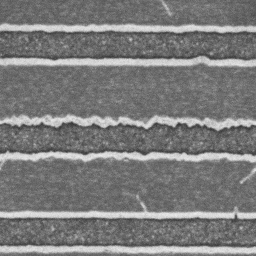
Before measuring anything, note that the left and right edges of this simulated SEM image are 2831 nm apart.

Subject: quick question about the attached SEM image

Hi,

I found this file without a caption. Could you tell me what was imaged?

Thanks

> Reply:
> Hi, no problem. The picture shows one or a few lines or trenches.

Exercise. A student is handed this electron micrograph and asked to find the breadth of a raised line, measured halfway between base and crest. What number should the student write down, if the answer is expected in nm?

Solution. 654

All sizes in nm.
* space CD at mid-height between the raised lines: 380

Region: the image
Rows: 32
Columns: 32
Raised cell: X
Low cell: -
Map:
XXXXXXXXXXXXXXXXXXXXXXXXXXXXXXXX
XXXXXXXXXXXXXXXXXXXXXXXXXXXXXXXX
XXXXXXXXXXXXXXXXXXXXXXXXXXXXXXXX
--X---X-XXX-X----XXXXXXX-XXXXXXX
--------------------------------
--------------------------------
--------------------------------
--------------------------------
XXXXXXXXXXXXXXXXXXXXXXXXXXXXXXXX
XXXXXXXXXXXXXXXXXXXXXXXXXXXXXXXX
XXXXXXXXXXXXXXXXXXXXXXXXXXXXXXXX
XXXXXXXXXXXXXXXXXXXXXXXXXXXXXXXX
XXXXXXXXXXXXXXXXXXXXXXXXXXXXXXXX
XXXXXXXXXXXXXXXXXXXXXXXXXXXXXXXX
XXXXXXXXXXXXXXXXXXXXXXXXXXXXXXXX
-----------------XX-------XX----
--------------------------------
--------------------------------
--------------------------------
X----XXXX---XXXX-----------XX---
XXXXXXXXXXXXXXXXXXXXXXXXXXXXXXXX
XXXXXXXXXXXXXXXXXXXXXXXXXXXXXXXX
XXXXXXXXXXXXXXXXXXXXXXXXXXXXXXXX
XXXXXXXXXXXXXXXXXXXXXXXXXXXXXXXX
XXXXXXXXXXXXXXXXXXXXXXXXXXXXXXXX
XXXXXXXXXXXXXXXXXXXXXXXXXXXXXXXX
XXXXXXXXXXXXXXXXXXXXXXXXXXXXXXXX
--------------------------------
--------------------------------
--------------------------------
--------------------------------
XXXXXXXXXXXXXXXXXXXXXXXXXXXXXXXX